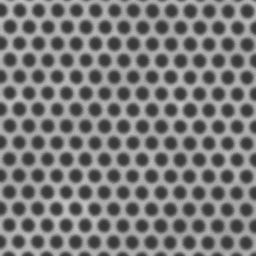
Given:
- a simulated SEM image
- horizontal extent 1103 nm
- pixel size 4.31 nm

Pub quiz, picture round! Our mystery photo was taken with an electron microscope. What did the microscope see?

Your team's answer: a regular array of holes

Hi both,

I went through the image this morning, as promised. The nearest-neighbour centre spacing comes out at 80.9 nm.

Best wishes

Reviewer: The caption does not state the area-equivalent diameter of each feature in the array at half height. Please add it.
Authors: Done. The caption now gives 57.1 nanometers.